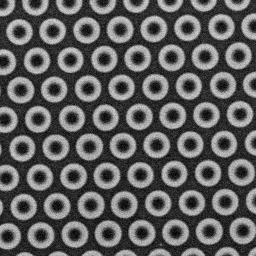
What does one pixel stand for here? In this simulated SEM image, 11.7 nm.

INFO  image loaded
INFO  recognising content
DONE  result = an array of small figures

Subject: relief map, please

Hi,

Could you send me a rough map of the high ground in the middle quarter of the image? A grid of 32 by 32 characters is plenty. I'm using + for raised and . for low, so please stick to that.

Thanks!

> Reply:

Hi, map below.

++++...++++++...+++++...+++++...
++++....++++.....+++......++....
..............................++
....++++....+++++....++++....+++
...++++++...+++++...++++++..++++
+..++++++..+++++++..++++++..++++
+..++++++..+++++++..++++++..++++
...++++++...+++++...+++++....+++
....++++.....+++.....++++.....++
................................
..+......+++.....++++....++++...
++++....+++++...++++++..++++++..
+++++..++++++...++++++..++++++..
+++++..+++++++..++++++..++++++..
+++++..++++++...++++++..++++++..
+++++...+++++...+++++....++++...
.++.......+.....................
..............++......+++.....++
....+++++...+++++....+++++...+++
+..++++++...++++++..++++++..++++
+..+++++++..++++++..++++++..++++
+..+++++++..++++++..++++++...+++
+...+++++...+++++....+++++...+++
.....+++......++................
..........................+++...
.+++.....++++....++++....+++++..
+++++...++++++..++++++...++++++.
+++++..+++++++..++++++...++++++.
++++++.+++++++..++++++...++++++.
+++++...++++++..++++++...+++++..
+++++....++++.....+++......++...
................................